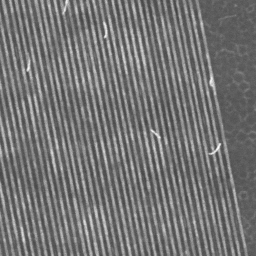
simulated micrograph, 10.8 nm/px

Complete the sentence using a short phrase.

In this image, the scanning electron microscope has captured parallel lines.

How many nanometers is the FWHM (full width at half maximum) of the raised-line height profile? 25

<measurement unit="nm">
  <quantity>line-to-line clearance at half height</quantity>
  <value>44.9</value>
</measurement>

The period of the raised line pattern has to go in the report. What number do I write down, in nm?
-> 68.3